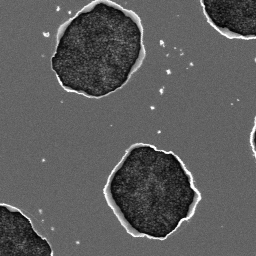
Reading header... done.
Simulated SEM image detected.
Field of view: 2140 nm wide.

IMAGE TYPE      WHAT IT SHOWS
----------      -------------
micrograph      holes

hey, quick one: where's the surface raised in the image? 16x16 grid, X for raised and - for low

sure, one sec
XXXXXX-XXXXXX---
XXXX-----XXXX---
XXXX-----XXXXXXX
XXX------XXXXXXX
XXX-----XXXXXXXX
XXXX---XXXXXXXXX
XXXXXXXXXXXXXXXX
XXXXXXXXXXXXXXXX
XXXXXXXXXXXXXXXX
XXXXXXXX--XXXXXX
XXXXXXX----XXXXX
XXXXXXX-----XXXX
XXXXXXX-----XXXX
-XXXXXXX----XXXX
--XXXXXX---XXXXX
---XXXXXXXXXXXXX